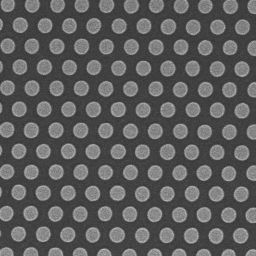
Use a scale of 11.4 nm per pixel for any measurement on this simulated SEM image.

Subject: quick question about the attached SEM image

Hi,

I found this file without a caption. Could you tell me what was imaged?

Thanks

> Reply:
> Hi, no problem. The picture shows a regular array of raised bodies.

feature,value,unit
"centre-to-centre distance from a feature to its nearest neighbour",273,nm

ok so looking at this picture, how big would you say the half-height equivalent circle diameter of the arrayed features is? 175 nm